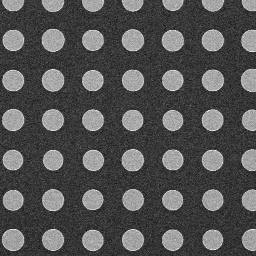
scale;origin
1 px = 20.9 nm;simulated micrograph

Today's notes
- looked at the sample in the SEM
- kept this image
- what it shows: an array of small figures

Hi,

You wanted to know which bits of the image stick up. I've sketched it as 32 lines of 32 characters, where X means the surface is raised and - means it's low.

XXX--XXX--XXX--XXX--XXX--XXX--XX
--------------------------------
--------------------------------
--------------------------------
-XX--XXX--XXX--XXX--XXX--XXX--XX
XXX--XXX--XXX--XXX--XXX--XXX--XX
--------------------------------
--------------------------------
--------------------------------
XXX--XXX--XXX--XXX--XXX--XXX--XX
XXX--XXX--XXX--XXX--XXX--XXX--XX
--------------------------------
--------------------------------
--------------------------------
XXX--XXX--XXX--XXX---XX--XXX--XX
XXX--XXX--XXX--XXX--XXX--XXX--XX
--------------------------------
--------------------------------
--------------------------------
-XX---XX---XX--XXX--XXX--XXX--XX
-XX---XX---XX--XXX--XXX--XXX--XX
--------------------------------
--------------------------------
--------------------------------
-XX--XXX---XX--XXX--XXX--XXX--XX
-XX--XXX--XXX---XX--XXX--XXX--XX
--------------------------------
--------------------------------
--------------------------------
XXX--XXX--XXX--XXX--XXX--XXX--XX
XXX--XXX--XXX--XXX--XXX---XX--XX
--------------------------------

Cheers